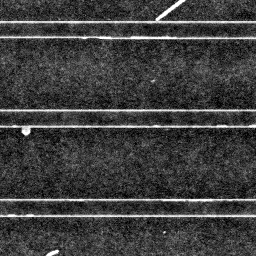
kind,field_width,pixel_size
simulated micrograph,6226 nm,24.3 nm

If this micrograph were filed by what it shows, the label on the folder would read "lines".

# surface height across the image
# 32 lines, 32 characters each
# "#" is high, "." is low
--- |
................................
................................
................................
################################
################################
................................
................................
................................
................................
................................
................................
................................
................................
................................
################################
################################
................................
................................
................................
................................
................................
................................
................................
................................
................................
################################
################################
................................
................................
................................
................................
................................